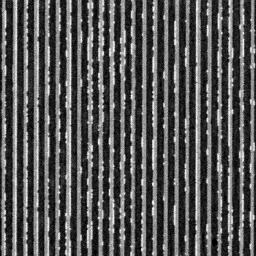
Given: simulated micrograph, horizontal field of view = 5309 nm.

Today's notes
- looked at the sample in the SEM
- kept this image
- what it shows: parallel lines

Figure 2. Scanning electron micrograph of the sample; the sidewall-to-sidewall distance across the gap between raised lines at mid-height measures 150 nm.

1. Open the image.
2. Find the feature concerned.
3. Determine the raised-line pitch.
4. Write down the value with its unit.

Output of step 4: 224 nanometers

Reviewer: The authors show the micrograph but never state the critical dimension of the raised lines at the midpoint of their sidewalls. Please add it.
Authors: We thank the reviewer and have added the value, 62.2 nanometres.